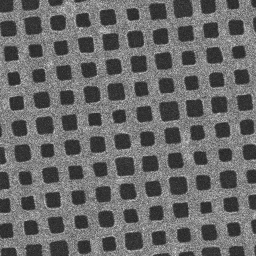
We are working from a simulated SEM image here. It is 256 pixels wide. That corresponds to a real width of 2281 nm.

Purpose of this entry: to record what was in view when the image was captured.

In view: a regular array of holes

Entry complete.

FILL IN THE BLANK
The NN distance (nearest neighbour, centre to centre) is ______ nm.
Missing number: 222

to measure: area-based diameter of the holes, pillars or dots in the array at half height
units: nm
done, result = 150